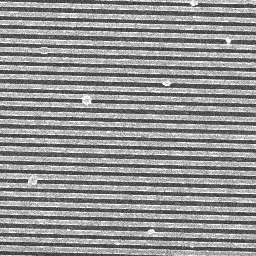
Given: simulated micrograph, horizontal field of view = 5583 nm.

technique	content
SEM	parallel lines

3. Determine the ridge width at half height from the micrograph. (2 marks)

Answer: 4.87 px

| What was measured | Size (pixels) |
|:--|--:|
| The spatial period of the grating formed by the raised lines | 9.04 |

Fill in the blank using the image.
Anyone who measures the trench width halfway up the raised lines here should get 84.5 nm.